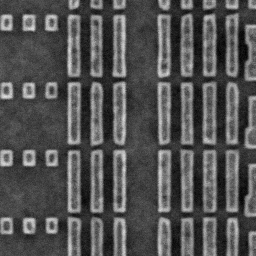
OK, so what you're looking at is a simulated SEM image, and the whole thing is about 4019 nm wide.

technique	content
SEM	wiring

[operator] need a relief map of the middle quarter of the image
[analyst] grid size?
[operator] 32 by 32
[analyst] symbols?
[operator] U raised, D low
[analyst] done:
DUUUDDDUUDDDDUUDDDDDDDDDUUDDDDUU
DUUUDDDUUDDDDUUDDDDDDDDDUUDDDDUU
DDUDDDDUUDDDDUUDDDDDDDDDUUDDDDUD
DDDDDDDDDDDDDDDDDDDDDDDDDDDDDDDD
DDDDDDDDDDDDDDDDDDDDDDDDDDDDDDDD
DUUUDDDUUDDDDUUDDDDDDDDDUUDDDDUU
DUUUDDDUUDDDDUUDDDDDDDDDUUDDDDUU
DUUUDDDUUDDDDUUDDDDDDDDDUUDDDDUU
DUUUDDDUUDDDDUUDDDDDDDDDUUDDDDUU
DUUUDDDUUDDDDUUDDDDDDDDDUUDDDDUU
DUUUDDDUUDDDDUUDDDDDDDDDUUDDDDUU
DUUUDDDUUDDDDUUDDDDDDDDDUUDDDDUU
DUUUDDDUUDDDDUUDDDDDDDDDUUDDDDUU
DUUUDDDUUDDDDUUDDDDDDDDDUUDDDDUU
DUUUDDDUUDDDDUUDDDDDDDDDUUDDDDUU
DUUUDDDUUDDDDUUDDDDDDDDDUUDDDDUU
DUUUDDDUUDDDDUUDDDDDDDDDUUDDDDUU
DUUUDDDUUDDDDUUDDDDDDDDDUUDDDDUU
DUUUDDDUUDDDDUUDDDDDDDDDUUDDDDUU
DDUDDDDUUDDDDUUDDDDDDDDDUUDDDDUU
DDDDDDDDDDDDDDDDDDDDDDDDDDDDDDDD
DDDDDDDDDDDDDDDDDDDDDDDDDDDDDDDD
DUUUDDDUUDDDDUUDDDDDDDDDUUDDDDUU
DUUUDDDUUDDDDUUDDDDDDDDDUUDDDDUU
DUUUDDDUUDDDDUUDDDDDDDDDUUDDDDUU
DUUUDDDUUDDDDUUDDDDDDDDDUUDDDDUU
DUUUDDDUUDDDDUUDDDDDDDDDUUDDDDUU
DUUUDDDUUDDDDUUDDDDDDDDDUUDDDDUU
DUUUDDDUUDDDDUUDDDDDDDDDUUDDDDUU
DUUUDDDUUDDDDUUDDDDDDDDDUUDDDDUU
DUUUDDDUUDDDDUUDDDDDDDDDUUDDDDUU
DUUUDDDUUDDDDUUDDDDDDDDDUUDDDDUU